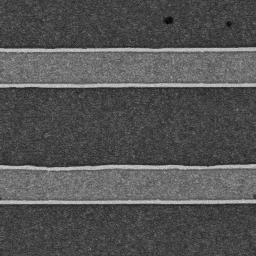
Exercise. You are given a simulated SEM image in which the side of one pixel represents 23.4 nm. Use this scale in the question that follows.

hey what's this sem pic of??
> one or a few lines or trenches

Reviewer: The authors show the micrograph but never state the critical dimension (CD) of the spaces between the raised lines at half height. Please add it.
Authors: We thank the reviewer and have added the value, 1920 nm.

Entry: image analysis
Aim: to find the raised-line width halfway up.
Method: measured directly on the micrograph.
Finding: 823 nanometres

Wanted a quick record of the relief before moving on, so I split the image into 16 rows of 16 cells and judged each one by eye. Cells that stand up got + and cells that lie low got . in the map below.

................
................
................
++++++++++++++++
++++++++++++++++
................
................
................
................
................
+++...++++++.+++
++++++++++++++++
++++++++++++++++
................
................
................